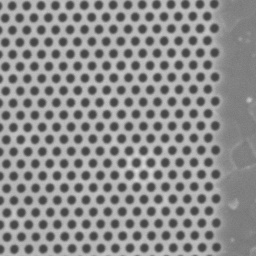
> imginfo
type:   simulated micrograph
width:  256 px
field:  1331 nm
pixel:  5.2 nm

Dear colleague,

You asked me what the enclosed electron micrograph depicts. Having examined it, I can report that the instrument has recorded a regular array of holes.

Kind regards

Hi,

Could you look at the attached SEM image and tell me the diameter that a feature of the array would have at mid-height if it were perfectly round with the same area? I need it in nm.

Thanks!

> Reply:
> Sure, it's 47.6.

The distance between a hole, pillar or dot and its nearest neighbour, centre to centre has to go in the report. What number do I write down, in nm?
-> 72.6